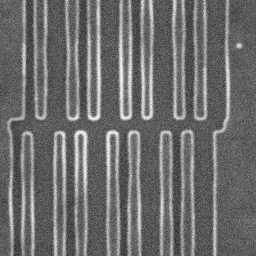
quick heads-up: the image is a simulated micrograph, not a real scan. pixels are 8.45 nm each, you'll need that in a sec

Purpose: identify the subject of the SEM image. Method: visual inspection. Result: groups of lines, slits or small figures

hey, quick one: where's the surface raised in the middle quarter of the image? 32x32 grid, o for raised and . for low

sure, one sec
.oo...ooo.....ooo...oo......oo..
.oo...ooo.....oo....oo......oo..
.oo...ooo.....oo....oo......oo..
.oo...ooo.....oo....oo......oo..
.oo...ooo.....oo....oo......oo..
.oo...ooo.....oo....oo......oo..
.oo...ooo.....oo....oo......oo..
.oo...ooo.....oo....oo......oo..
.oo...ooo.....oo....oo......oo..
.oo...ooo.....oo....oo......oo..
.oo...ooo.....ooo...oo......oo..
.oo...ooo.....ooo...oo......oo..
.oo...ooo.....ooo...oo......oo..
.oo....o.......o....oo......oo..
................................
................................
................................
...oo......oo...ooo.....ooo...oo
...oo......oo...ooo.....ooo...oo
...oo......oo...ooo.....ooo...oo
...oo......oo...ooo.....ooo...oo
...oo......oo...ooo.....ooo...oo
...oo......oo...ooo.....ooo...oo
...oo......oo...ooo.....ooo...oo
...oo......oo...ooo.....ooo...oo
...oo......oo...ooo.....ooo...oo
...oo......oo....oo.....ooo...oo
...oo......oo....oo.....ooo...oo
...oo......oo...ooo.....ooo...oo
...oo......oo...ooo......oo...oo
...oo......ooo..ooo......oo...oo
...oo......ooo..ooo......oo...oo